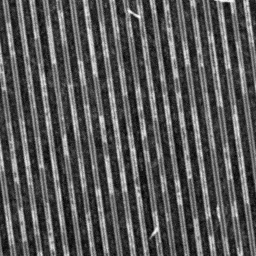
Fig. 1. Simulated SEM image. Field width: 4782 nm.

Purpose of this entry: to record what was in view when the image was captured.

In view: parallel lines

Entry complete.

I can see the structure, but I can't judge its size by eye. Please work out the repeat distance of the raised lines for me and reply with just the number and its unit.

0.247 microns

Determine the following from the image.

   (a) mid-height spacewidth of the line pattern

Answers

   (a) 176 nm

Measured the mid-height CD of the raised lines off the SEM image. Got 78.7 nanometres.